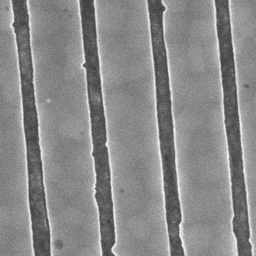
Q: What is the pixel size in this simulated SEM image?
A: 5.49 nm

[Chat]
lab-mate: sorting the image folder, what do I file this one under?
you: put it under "one or a few lines or trenches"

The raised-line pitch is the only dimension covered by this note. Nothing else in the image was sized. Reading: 368 nm